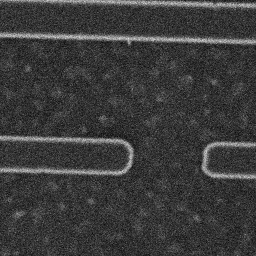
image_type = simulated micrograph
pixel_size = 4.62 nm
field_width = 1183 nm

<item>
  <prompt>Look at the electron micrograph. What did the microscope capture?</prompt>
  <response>one or a few lines or trenches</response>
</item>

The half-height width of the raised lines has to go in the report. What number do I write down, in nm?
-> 168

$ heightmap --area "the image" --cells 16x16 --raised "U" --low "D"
UUUUUUUUUUUUUUUU
UUUUUUUUUUUUUUUU
DDDDDDDDDDDUUUUU
DDDDDDDDDDDDDDDD
DDDDDDDDDDDDDDDD
DDDDDDDDDDDDDDDD
DDDDDDDDDDDDDDDD
DDDDDDDDDDDDDDDD
DDDDDDDDDDDDDDDD
UUUUUUUUDDDDDUUU
UUUUUUUUDDDDDUUU
DDDDDDDDDDDDDDDD
DDDDDDDDDDDDDDDD
DDDDDDDDDDDDDDDD
DDDDDDDDDDDDDDDD
DDDDDDDDDDDDDDDD